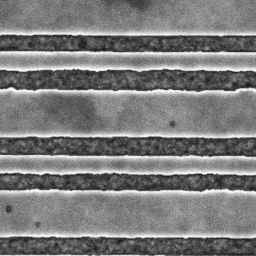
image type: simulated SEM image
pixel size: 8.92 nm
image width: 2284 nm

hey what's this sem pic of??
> lines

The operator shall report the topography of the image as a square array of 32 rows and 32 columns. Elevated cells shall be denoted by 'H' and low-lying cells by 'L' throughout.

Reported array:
HHHHHHHHHHHHHHHHHHHHHHHHHHHHHHHH
HHHHHHHHHHHHHHHHHHHHHHHHHHHHHHHH
HHHHHHHHHHHHHHHHHHHHHHHHHHHHHHHH
HHHHHHHHHHHHHHHHHHHHHHHHHHHHHHHH
LLLLLLLLLLLLLLLLLLLLLLLLLLLLLLLL
LLLLLLLLLLLLLLLLLLLLLLLLLLLLLLLL
LLLLLLLLLLLLLLLLLLLLLLLLLLLLLLLL
HHHHHHHHHHHHHHHHHHHHHHHHHHHHHHHH
HHHHHHHHHHHHHHHHHHHHHHHHHHHHHHHH
LLLLLLLLLLLLLLLLLLLLLLLLLLLLLLLL
LLLLLLLLLLLLLLLLLLLLLLLLLLLLLLLL
HHHHHHHHHHHHHHHHHHHHHHHHHHHHHHHH
HHHHHHHHHHHHHHHHHHHHHHHHHHHHHHHH
HHHHHHHHHHHHHHHHHHHHHHHHHHHHHHHH
HHHHHHHHHHHHHHHHHHHHHHHHHHHHHHHH
HHHHHHHHHHHHHHHHHHHHHHHHHHHHHHHH
HHHHHHHHHHHHHHHHHHHHHHHHHHHHHHHH
LLLLLLLLLLLLLLLLLLLLLLLLLLLLLLLL
LLLLLLLLLLLLLLLLLLLLLLLLLLLLLLLL
HHHHHHHHHLLLLLLHLLLLLLLHLLLLLLLL
HHHHHHHHHHHHHHHHHHHHHHHHHHHHHHHH
HHHHHHHHHHHHHHHHHHHHHHHHHHHHHHHH
LLLLLLLLLLLLLLLLLLLLLLLLLLLLLLLL
LLLLLLLLLLLLLLLLLLLLLLLLLLLLLLLL
HHHHHHHHHHHHHHHHHHHHHHHHHHHHHHHH
HHHHHHHHHHHHHHHHHHHHHHHHHHHHHHHH
HHHHHHHHHHHHHHHHHHHHHHHHHHHHHHHH
HHHHHHHHHHHHHHHHHHHHHHHHHHHHHHHH
HHHHHHHHHHHHHHHHHHHHHHHHHHHHHHHH
HHLLHHHHHHHHHHHHHHHHHHHHHHHHHHHH
LLLLLLLLLLLLLLLLLLLLLLLLLLLLLLLL
LLLLLLLLLLLLLLLLLLLLLLLLLLLLLLLL